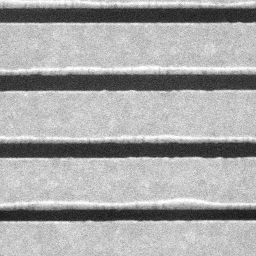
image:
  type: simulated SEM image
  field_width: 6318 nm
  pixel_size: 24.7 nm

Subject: lines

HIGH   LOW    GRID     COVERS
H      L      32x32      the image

LLHHHHHHHHHHHHHHHHHHHHHHHHHHHHHH
LLLLLLLLLLLLLLLLLLLLLLLLLLLLLLLL
LLLLLLLLLLLLLLLLLLLLLLLLLLLLLLLL
HHHHHHHHHHHHHHHHHHHHHHHHHHHHHHHH
HHHHHHHHHHHHHHHHHHHHHHHHHHHHHHHH
HHHHHHHHHHHHHHHHHHHHHHHHHHHHHHHH
HHHHHHHHHHHHHHHHHHHHHHHHHHHHHHHH
HHHHHHHHHHHHHHHHHHHHHHHHHHHHHHHH
HHHHHHHHHHHHHHHHHHHHHHHHHHHHHHHH
LLLLLLLLLLLLLLLLLLLLLLLLLLLLLLLL
LLLLLLLLLLLLLLLLLLLLLLLLLLLLLLLL
HHHHHHHHHHHHHHHHHHHHHHHHHHHHHHHH
HHHHHHHHHHHHHHHHHHHHHHHHHHHHHHHH
HHHHHHHHHHHHHHHHHHHHHHHHHHHHHHHH
HHHHHHHHHHHHHHHHHHHHHHHHHHHHHHHH
HHHHHHHHHHHHHHHHHHHHHHHHHHHHHHHH
HHHHHHHHHHHHHHHHHHHHHHHHHHHHHHHH
LLLLLLLLLLLLLLLLLLLLLLLLLLLLLLLL
LLLLLLLLLLLLLLLLLLLLLLLLLLLLLLLL
LLLLLLLLLLLLLLLLLLLLLLLLLLLLLLLL
HHHHHHHHHHHHHHHHHHHHHHHHHHHHHHHH
HHHHHHHHHHHHHHHHHHHHHHHHHHHHHHHH
HHHHHHHHHHHHHHHHHHHHHHHHHHHHHHHH
HHHHHHHHHHHHHHHHHHHHHHHHHHHHHHHH
HHHHHHHHHHHHHHHHHHHHHHHHHHHHHHHH
HHHHHHHHHHHHHHHHHHHHHHHHHHHHHHHH
LLLLLLLLLLLLLLLLLLLLLLLLLLLLLLLL
LLLLLLLLLLLLLLLLLLLLLLLLLLLLLLLL
HHHHHHHHHHHHHHHHHHHHHHHHHHHHHHHH
HHHHHHHHHHHHHHHHHHHHHHHHHHHHHHHH
HHHHHHHHHHHHHHHHHHHHHHHHHHHHHHHH
HHHHHHHHHHHHHHHHHHHHHHHHHHHHHHHH